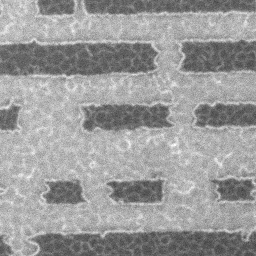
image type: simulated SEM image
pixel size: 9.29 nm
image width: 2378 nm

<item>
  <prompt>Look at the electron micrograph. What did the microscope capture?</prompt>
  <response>one or a few lines or trenches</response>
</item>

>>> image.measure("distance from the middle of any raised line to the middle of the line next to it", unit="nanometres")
587